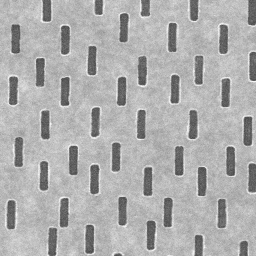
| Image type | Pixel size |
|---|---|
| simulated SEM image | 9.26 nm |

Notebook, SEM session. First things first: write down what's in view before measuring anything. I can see a regular array of holes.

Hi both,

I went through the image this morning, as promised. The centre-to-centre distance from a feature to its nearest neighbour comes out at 318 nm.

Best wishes